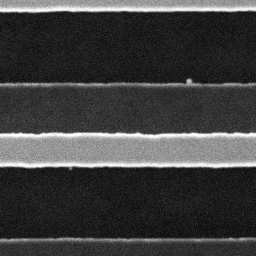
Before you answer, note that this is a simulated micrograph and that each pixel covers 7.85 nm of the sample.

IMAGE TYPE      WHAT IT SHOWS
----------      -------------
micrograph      lines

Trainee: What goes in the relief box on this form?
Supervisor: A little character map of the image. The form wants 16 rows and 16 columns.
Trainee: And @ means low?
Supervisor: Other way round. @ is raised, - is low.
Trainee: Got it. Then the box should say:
@@@@@@@@@@@@@@@@
----------------
----------------
----------------
----------------
@@@@@@@@@@@@@@@@
@@@@@@@@@@@@@@@@
@@@@@@@@@@@@@@@@
@@@@@@@@@@@@@@@@
@@@@@@@@@@@@@@@@
----------------
----------------
----------------
----------------
----------------
@@@@@@@@@@@@@@@@